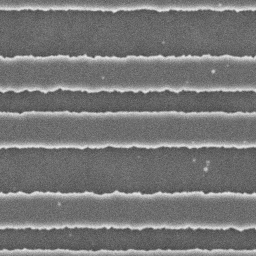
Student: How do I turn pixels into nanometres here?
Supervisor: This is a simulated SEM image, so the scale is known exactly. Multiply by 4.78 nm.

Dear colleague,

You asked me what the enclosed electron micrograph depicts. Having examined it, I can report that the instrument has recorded lines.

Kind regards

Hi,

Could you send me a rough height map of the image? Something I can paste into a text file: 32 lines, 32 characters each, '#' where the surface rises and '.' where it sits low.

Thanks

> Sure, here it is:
################################
................................
................................
................................
................................
................................
................................
################################
################################
################################
################################
#.#..#.....#...####.............
................................
................................
################################
################################
################################
################################
..........#.....................
................................
................................
................................
................................
................................
################################
################################
################################
################################
#.#.####........##...##.########
................................
................................
################################